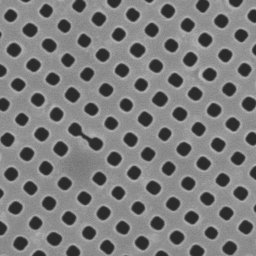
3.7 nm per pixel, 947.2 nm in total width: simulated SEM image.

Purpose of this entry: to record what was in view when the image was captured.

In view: a regular array of holes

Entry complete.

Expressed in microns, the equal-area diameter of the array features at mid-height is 0.0507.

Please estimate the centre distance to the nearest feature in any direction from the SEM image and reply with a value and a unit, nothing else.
88.9 nanometres